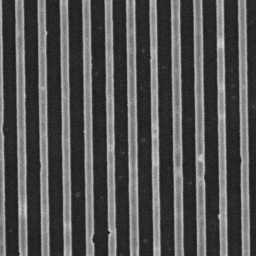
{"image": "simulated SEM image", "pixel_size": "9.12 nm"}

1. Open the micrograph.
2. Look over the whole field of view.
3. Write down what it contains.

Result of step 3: parallel lines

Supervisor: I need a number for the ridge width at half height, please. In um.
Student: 0.0707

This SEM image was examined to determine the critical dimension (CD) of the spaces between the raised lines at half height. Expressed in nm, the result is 133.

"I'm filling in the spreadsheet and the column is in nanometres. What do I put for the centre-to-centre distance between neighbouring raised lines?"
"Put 203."